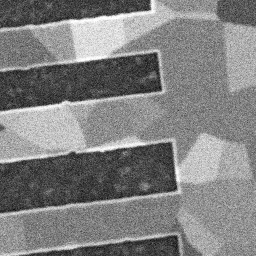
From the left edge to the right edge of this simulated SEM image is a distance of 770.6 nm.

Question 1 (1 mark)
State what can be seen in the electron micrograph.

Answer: one or a few lines or trenches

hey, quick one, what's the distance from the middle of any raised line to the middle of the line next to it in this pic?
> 274 nm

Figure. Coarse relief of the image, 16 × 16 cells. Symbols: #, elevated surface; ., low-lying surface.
.........#######
...#############
################
#######...######
..........######
..........######
....############
################
################
####.......#####
...........#####
...........#####
........########
################
################
####.......#####